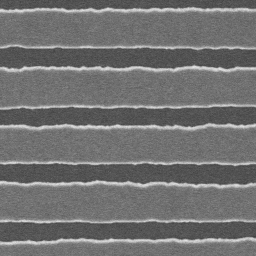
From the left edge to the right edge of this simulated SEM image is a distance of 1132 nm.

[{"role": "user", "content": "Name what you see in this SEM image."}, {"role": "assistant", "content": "lines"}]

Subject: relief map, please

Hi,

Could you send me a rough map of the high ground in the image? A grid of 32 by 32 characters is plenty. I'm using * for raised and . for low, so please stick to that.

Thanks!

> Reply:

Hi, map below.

................................
********************************
********************************
********************************
********************************
********************************
................................
................................
*..***********..***...******.***
********************************
********************************
********************************
********************************
**..*...........................
................................
................................
********************************
********************************
********************************
********************************
*.......**.***..*..***..**.*****
................................
................................
********************************
********************************
********************************
********************************
********************************
................................
................................
********************************
********************************